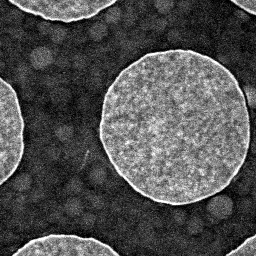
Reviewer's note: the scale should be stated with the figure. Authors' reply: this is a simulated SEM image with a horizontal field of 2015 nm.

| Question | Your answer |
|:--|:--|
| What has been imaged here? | raised bodies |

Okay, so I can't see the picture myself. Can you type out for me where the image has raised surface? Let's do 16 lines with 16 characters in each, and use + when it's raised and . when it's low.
.++++++........+
................
................
..+......++++...
........++++++..
+......++++++++.
+......+++++++++
+.....++++++++++
+.....++++++++++
+......++++++++.
+......++++++++.
........++++++..
..........++.+..
.............+..
................
.++++++........+